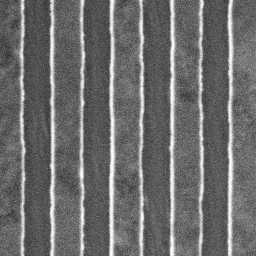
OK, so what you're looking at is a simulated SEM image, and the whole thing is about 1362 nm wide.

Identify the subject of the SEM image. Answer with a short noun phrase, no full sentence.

lines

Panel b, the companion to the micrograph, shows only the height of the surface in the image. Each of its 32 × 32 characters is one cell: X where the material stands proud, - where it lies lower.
XXX----XXX----XXXX---XXXX----XXX
XXX----XXX----XXXX----XXX----XXX
XXX----XXX----XXXX----XXX----XXX
XXX----XXX----XXXX----XXX----XXX
XXX----XXX----XXXX----XXX----XXX
XXX----XXX----XXXX----XXX----XXX
XXX---XXXX----XXXX---XXXX----XXX
XXX---XXXX----XXXX---XXXX----XXX
XXX----XXX----XXXX----XXX----XXX
XXX----XXX----XXXX----XXX----XXX
XXX----XXX----XXXX----XXX----XXX
XXX----XXX----XXXX---XXXX----XXX
XXX----XXX----XXXX---XXXX----XXX
XXX----XXX----XXXX----XXX----XXX
XXX----XXX----XXXX---XXXX----XXX
XXX----XXX----XXXX---XXXX----XXX
XXX----XXX----XXXX----XXX----XXX
XXX----XXX----XXXX---XXXX----XXX
XXX----XXX----XXXX---XXXX----XXX
XXX----XXX----XXXX---XXXX----XXX
XXX----XXX----XXXX---XXXX----XXX
XXX----XXX----XXXX---XXXX----XXX
XXX----XXX----XXXX---XXXX----XXX
XXX----XXX----XXXX---XXXX----XXX
XXX----XXX----XXXX---XXXX----XXX
XXX----XXX----XXXX----XXX----XXX
XXX----XXX----XXXX----XXX----XXX
XXX----XXX----XXXX---XXXX----XXX
XXX----XXX----XXXX---XXXX----XXX
XXX----XXX----XXXX---XXXX----XXX
XXX----XXX----XXXX---XXXX----XXX
XXX----XXX----XXXX---XXXX----XXX